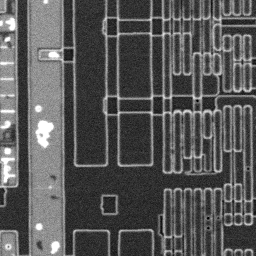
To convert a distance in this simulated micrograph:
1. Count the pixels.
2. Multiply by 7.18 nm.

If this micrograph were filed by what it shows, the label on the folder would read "wiring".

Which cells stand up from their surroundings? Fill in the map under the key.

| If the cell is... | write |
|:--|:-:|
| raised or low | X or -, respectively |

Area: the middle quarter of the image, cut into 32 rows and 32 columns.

--XXXXXXXXX--XXXXXXXXX---XXXXXXX
--XXXXXXXXX--XXXXXXXXX---XXXXXXX
---XXXXXXXX--XXXXXXXXX---XX-X-XX
---XXXXXXXX--XXXXXXXXX---XX-----
---XXXXXXXX--XXXXXXXXX---XX-----
---XXXXXXXX--XXXXXXXXX---XX-----
---XXXXXXXX--XXXXXXXXX---XX-----
---XXXXXXXX--XXXXXXXXX---XX-----
---XXXXXXXX---XXXXXXXX---X------
---XXXXXXX----------------------
---XXXXXXX----------------------
---XXXXXXX----------------------
---XXXXXXXX---XXXXXXXX---XXXXXXX
---XXXXXXXX---XXXXXXXX---XXXXXXX
---XXXXXXXX---XXXXXXXX---XXXXXXX
---XXXXXXXX---XXXXXXXX---XXXXXXX
---XXXXXXXX---XXXXXXXX---XXXXXXX
---XXXXXXXX---XXXXXXXX---XXXXXXX
---XXXXXXXX---XXXXXXXX---XXXXXXX
---XXXXXXXX---XXXXXXXX---XXXXXXX
---XXXXXXXX---XXXXXXXX---XXXXXXX
---XXXXXXXX---XXXXXXXX---XXXXXXX
---XXXXXXXX---XXXXXXXX---XXXXXXX
---XXXXXXXX---XXXXXXXX---XXXXXXX
---XXXXXXXX---XXXXXXXX---XXXXX--
---XXXXXXX----XXXX-------XXXXX--
-------------------------XXXXX--
--------------------------------
--------------------------------
--------------------------------
--------------------------------
-------------------------XX-X-XX